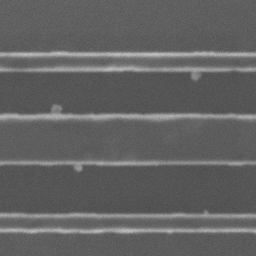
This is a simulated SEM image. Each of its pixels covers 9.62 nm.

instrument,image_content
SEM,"lines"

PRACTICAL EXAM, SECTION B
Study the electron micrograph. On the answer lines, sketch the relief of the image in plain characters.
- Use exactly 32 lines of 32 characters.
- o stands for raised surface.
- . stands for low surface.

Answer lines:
................................
................................
................................
................................
................................
................................
................................
oooooooooooooooooooooooooooooooo
oooooooooooooooooooooooooooooooo
................................
................................
................................
................................
................................
oooooooooooooooooooooooooooooooo
oooooooooooooooooooooooooooooooo
oooooooooooooooooooooooooooooooo
oooooooooooooooooooooooooooooooo
oooooooooooooooooooooooooooooooo
oooooooooooooooooooooooooooooooo
..............oo................
................................
................................
................................
................................
................................
................................
oooooooooooooooooooooooooooooooo
oooooooooooooooooooooooooooooooo
................................
................................
................................